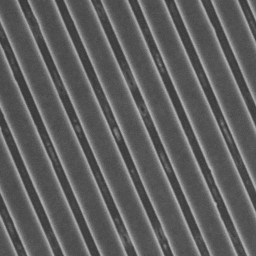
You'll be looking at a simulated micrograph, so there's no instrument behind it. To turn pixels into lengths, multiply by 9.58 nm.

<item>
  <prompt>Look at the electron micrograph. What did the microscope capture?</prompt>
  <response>parallel lines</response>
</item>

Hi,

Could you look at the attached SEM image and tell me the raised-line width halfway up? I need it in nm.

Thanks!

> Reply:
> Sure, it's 235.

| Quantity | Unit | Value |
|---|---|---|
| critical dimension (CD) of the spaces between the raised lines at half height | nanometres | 90.2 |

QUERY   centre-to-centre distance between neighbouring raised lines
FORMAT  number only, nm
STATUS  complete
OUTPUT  322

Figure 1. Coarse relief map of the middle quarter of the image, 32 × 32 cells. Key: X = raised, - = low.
XXXXX--XXXXXXX--XXXXXXX--XXXXXXX
XXXXX---XXXXXX---XXXXXX---XXXXXX
XXXXX---XXXXXXX--XXXXXXX--XXXXXX
XXXXXX--XXXXXXX---XXXXXX---XXXXX
XXXXXX---XXXXXXX--XXXXXXX--XXXXX
XXXXXXX--XXXXXXX---XXXXXX---XXXX
-XXXXXX---XXXXXX---XXXXXX---XXXX
-XXXXXXX--XXXXXXX--XXXXXXX--XXXX
-XXXXXXX---XXXXXX---XXXXXX---XXX
--XXXXXX---XXXXXXX--XXXXXXX--XXX
--XXXXXXX--XXXXXXX---XXXXXX---XX
---XXXXXX---XXXXXXX--XXXXXXX--XX
X--XXXXXXX--XXXXXXX---XXXXXX---X
X---XXXXXX---XXXXXX---XXXXXX---X
XX--XXXXXXX--XXXXXXX--XXXXXXX--X
XX--XXXXXXX---XXXXXX---XXXXXX---
XX---XXXXXXX--XXXXXXX--XXXXXXX--
XXX--XXXXXXX--XXXXXXX---XXXXXX--
XXX---XXXXXXX--XXXXXXX--XXXXXXX-
XXXX--XXXXXXX--XXXXXXX--XXXXXXX-
XXXX---XXXXXX---XXXXXX---XXXXXX-
XXXXX--XXXXXXX--XXXXXXX--XXXXXXX
XXXXX--XXXXXXX---XXXXXX---XXXXXX
XXXXX---XXXXXXX--XXXXXXX--XXXXXX
XXXXXX--XXXXXXX---XXXXXX---XXXXX
XXXXXX---XXXXXXX--XXXXXXX--XXXXX
XXXXXXX--XXXXXXX--XXXXXXX--XXXXX
-XXXXXX---XXXXXX---XXXXXX---XXXX
-XXXXXXX--XXXXXXX--XXXXXXX--XXXX
-XXXXXXX--XXXXXXX---XXXXXX---XXX
--XXXXXX---XXXXXX---XXXXXXX--XXX
--XXXXXXX--XXXXXXX--XXXXXXX---XX